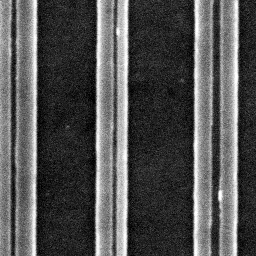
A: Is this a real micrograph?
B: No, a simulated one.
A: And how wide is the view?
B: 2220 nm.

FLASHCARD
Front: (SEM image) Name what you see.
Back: lines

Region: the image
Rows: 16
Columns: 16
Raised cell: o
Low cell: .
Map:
oo....oo....ooo.
oo....oo....ooo.
oo....oo....ooo.
oo....oo....ooo.
oo....oo....ooo.
oo....oo....ooo.
oo....oo....ooo.
oo....oo....ooo.
oo....oo....ooo.
oo....oo....ooo.
oo....oo....ooo.
oo....oo....ooo.
oo....oo....ooo.
oo....oo....ooo.
oo....oo....ooo.
oo....oo....ooo.